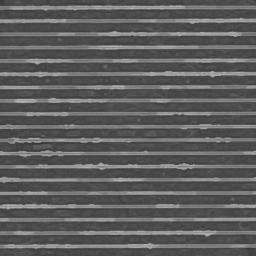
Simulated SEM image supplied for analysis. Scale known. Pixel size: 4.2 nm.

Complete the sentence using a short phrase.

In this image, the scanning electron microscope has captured parallel lines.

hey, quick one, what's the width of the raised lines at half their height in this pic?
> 10.5 nm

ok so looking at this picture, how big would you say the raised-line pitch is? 13.2 px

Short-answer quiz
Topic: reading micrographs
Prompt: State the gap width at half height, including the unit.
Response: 45.1 nm